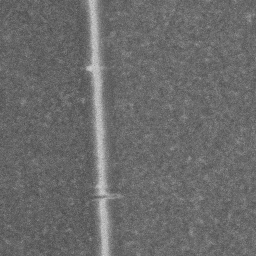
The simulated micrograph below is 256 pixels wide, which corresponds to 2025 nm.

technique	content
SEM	one or a few lines or trenches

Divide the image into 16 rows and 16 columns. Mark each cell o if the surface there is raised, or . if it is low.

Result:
......oooooooooo
......oooooooooo
......oooooooooo
......oooooooooo
......oooooooooo
......oooooooooo
......oooooooooo
......oooooooooo
......oooooooooo
......oooooooooo
......oooooooooo
......oooooooooo
......oooooooooo
......oooooooooo
......oooooooooo
.......ooooooooo